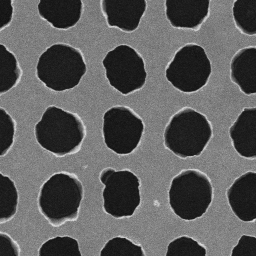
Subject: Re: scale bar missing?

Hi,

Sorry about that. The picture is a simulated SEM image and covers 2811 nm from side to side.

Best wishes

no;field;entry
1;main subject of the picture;a regular array of holes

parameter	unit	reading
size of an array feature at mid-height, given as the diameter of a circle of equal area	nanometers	485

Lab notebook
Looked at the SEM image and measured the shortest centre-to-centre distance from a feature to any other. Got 678 nm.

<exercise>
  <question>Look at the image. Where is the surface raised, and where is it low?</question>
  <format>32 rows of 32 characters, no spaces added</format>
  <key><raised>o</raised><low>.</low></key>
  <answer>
.oooo.....ooo.....ooo.....ooo...
..ooo.....ooo.....ooo.....ooo...
.ooooo....ooo....oooo....oooo...
ooooooo.ooooooo..ooooooooooooo..
oooooooooooooooooooooooooooooooo
oooooooooooooooooooooooooooooooo
.ooooo....oooo...ooooo....oooo..
..ooo.....ooo.....oooo....ooo...
..ooo......oo.....ooo.....ooo...
..ooo.....ooo.....ooo.....ooo...
..oooo....oooo....oooo...ooooo..
.oooooooooooooo.ooooooo.ooooooo.
oooooooooooooooooooooooooooooooo
oooooo.ooooooo.ooooooooooooooooo
.oooo....oooo....ooooo...ooooo..
..ooo.....ooo.....ooo.....ooo...
..oo......ooo.....ooo.....ooo...
..ooo.....ooo....oooo.....ooo...
.ooooo...ooooo...oooo....oooo...
ooooooooooooooooooooooo.oooooo..
oooooooooooooooooooooooooooooooo
ooooooooooooo...ooooooo.oooooooo
.ooooo...oooo....ooooo....oooo..
..ooo.....ooo....oooo.....ooo...
..ooo.....ooo....oooo.....ooo...
..ooo.....ooo....oooo.....ooo...
..ooo.....ooo....ooooo....ooo...
oooooo.ooooooooooooooooooooooo..
oooooooooooooooooooooooooooooooo
.ooooooooooooooooooooooooooooo.o
.ooooo....ooo....oooo....ooooo..
..ooo.....ooo.....ooo.....ooo...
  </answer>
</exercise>